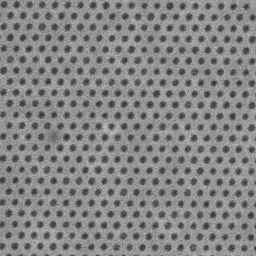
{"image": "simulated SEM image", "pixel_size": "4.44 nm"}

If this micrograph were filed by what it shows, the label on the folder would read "a regular array of holes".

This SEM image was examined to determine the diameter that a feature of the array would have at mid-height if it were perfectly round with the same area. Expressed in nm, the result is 32.5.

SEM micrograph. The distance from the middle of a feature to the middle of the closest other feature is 0.0551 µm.